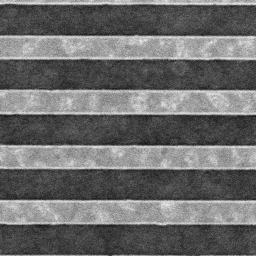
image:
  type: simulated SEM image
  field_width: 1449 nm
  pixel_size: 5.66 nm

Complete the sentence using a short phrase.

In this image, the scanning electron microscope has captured parallel lines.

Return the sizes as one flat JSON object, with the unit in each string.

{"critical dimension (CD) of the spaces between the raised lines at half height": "0.187 microns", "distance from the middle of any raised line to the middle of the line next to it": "0.311 micrometres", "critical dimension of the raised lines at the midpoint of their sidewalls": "21.8 px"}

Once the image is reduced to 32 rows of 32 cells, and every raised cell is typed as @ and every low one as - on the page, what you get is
--------------------------------
--------------------------------
--------------------------------
--------------------------------
--------------------------------
@@@@@@@@@@@@@@@@@@@@@@@@@@@@@@@@
@@@@@@@@@@@@@@@@@@@@@@@@@@@@@@@@
--------------------------------
--------------------------------
--------------------------------
--------------------------------
@@@@@@@@@@@@@@@@@@@@@@@@@@-@@@@@
@@@@@@@@@@@@@@@@@@@@@@@@@@@@@@@@
@@@@@@@@@@@@@@@@@@@@@@@@@@@@@@@@
--------------------------------
--------------------------------
--------------------------------
--------------------------------
@@@@@@@@@@@@@@@@@@@@@@@@@@@@@@@@
@@@@@@@@@@@@@@@@@@@@@@@@@@@@@@@@
@@@@@@@@@@@@@@@@@@@@@@@@@@@@@@@@
--------------------------------
--------------------------------
--------------------------------
--------------------------------
@@@@@@@@@@@@@@@@@@@@@@@@@@@@@@@@
@@@@@@@@@@@@@@@@@@@@@@@@@@@@@@@@
@@@@@@@@@@@@@@@@@@@@@@@@@@@@@@@@
--------------------------------
--------------------------------
--------------------------------
--------------------------------